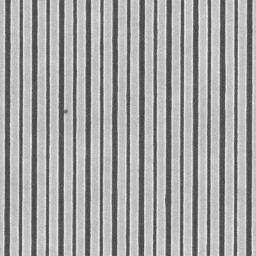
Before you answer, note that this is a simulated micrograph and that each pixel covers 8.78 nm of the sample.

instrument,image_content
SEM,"parallel lines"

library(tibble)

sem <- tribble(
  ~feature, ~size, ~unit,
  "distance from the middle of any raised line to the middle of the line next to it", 117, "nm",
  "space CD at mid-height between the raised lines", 0.0505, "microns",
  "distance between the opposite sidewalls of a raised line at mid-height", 75.7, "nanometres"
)